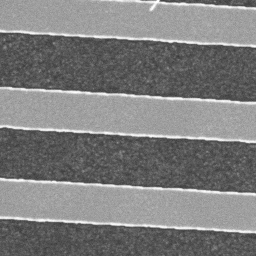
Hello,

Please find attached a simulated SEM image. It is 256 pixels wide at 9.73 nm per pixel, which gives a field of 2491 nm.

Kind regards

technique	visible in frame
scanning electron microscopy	lines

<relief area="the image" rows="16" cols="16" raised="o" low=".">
oooooooooooooooo
oooooooooooooooo
.........ooooooo
................
................
o...............
oooooooooooooooo
oooooooooooooooo
.........ooooooo
................
................
oooooo..........
oooooooooooooooo
oooooooooooooooo
...............o
................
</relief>